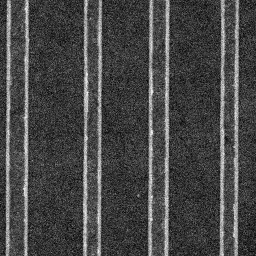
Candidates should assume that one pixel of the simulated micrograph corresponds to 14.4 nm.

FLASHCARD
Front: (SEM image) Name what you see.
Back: one or a few lines or trenches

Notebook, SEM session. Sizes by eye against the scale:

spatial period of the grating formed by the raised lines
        1020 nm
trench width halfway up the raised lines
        784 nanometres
